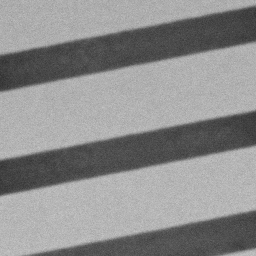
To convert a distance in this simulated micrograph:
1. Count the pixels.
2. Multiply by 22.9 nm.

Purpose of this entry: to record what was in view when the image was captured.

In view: lines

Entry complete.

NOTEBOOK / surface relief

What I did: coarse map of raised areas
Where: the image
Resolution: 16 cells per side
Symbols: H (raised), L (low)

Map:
HHHHHHHHHHHHHHHL
HHHHHHHHHHLLLLLL
HHHHHLLLLLLLLLLL
LLLLLLLLLLLLHHHH
LLLLLLHHHHHHHHHH
LHHHHHHHHHHHHHHH
HHHHHHHHHHHHHHHH
HHHHHHHHHHHHHLLL
HHHHHHHLLLLLLLLL
HHLLLLLLLLLLLLHH
LLLLLLLLLHHHHHHH
LLLLHHHHHHHHHHHH
HHHHHHHHHHHHHHHH
HHHHHHHHHHHHHHLL
HHHHHHHHHLLLLLLL
HHHHLLLLLLLLLLLL